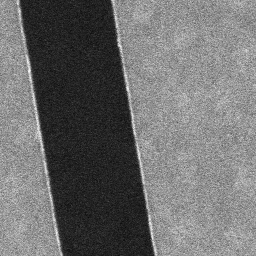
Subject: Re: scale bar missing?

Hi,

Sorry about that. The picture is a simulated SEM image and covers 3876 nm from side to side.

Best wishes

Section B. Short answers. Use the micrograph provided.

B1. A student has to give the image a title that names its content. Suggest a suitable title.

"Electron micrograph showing one or a few lines or trenches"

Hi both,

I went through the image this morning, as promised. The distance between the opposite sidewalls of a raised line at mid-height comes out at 1.44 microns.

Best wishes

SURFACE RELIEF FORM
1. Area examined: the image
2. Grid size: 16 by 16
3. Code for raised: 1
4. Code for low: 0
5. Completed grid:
0111111000000000
0111111000000000
0111111000000000
0011111100000000
0011111100000000
0011111100000000
0011111100000000
0011111100000000
0011111110000000
0001111110000000
0001111110000000
0001111110000000
0001111110000000
0001111110000000
0000111111000000
0000111111000000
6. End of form